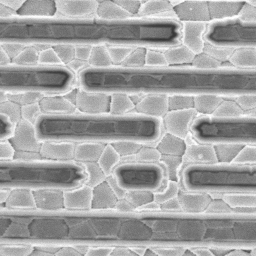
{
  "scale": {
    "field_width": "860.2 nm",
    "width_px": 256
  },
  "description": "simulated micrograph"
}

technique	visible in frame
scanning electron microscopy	parallel lines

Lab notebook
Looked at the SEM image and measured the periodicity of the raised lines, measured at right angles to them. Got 161 nm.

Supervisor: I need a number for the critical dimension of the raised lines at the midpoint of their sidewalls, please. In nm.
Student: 93.1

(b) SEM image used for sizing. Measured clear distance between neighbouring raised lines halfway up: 70.5 nm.